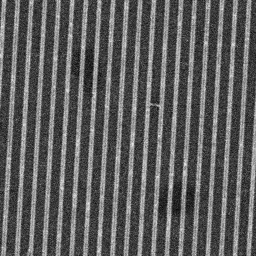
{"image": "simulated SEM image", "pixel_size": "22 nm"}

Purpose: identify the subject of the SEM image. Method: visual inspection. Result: parallel lines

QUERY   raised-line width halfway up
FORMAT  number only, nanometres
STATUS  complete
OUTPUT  57.7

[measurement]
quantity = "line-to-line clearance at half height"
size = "0.234 µm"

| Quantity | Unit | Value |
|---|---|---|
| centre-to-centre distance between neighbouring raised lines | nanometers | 300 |